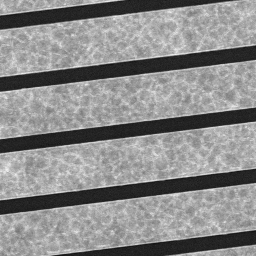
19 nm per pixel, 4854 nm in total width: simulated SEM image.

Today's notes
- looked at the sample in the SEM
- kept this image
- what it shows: parallel lines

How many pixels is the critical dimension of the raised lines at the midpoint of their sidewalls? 46.9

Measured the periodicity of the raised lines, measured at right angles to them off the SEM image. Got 1160 nanometers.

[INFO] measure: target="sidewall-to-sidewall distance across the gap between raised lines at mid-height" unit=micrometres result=0.268